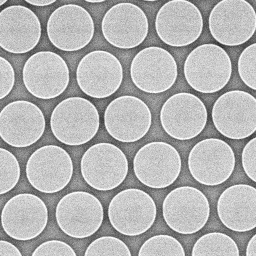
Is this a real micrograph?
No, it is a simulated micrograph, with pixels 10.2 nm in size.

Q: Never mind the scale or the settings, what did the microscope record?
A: an array of small figures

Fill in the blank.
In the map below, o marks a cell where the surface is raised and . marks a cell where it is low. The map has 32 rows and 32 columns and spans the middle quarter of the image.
o...oooooooooo...ooooooooooo..oo
o..ooooooooooo...ooooooooooo..oo
o..ooooooooooo...ooooooooooo..oo
o..ooooooooooo...ooooooooooo...o
o...oooooooooo....oooooooooo...o
o...oooooooooo....ooooooooo.....
.....oooooooo.......ooooo.......
......oooooo.................oo.
..o...........oooo.........ooooo
oooooo......oooooooo......oooooo
ooooooo....oooooooooo....ooooooo
oooooooo...oooooooooo...oooooooo
oooooooo..oooooooooooo..oooooooo
ooooooooo.oooooooooooo..oooooooo
ooooooooo.oooooooooooo..oooooooo
ooooooooo.ooooooooooo....ooooooo
oooooooo...oooooooooo....ooooooo
oooooooo....oooooooo......oooooo
ooooooo......oooooo.........oooo
ooooo...........................
.......ooooo........ooooooo.....
......oooooooo.....ooooooooo....
o....oooooooooo...ooooooooooo...
o....oooooooooo...ooooooooooo..o
oo..oooooooooooo..ooooooooooo..o
oo..oooooooooooo..ooooooooooo..o
oo..oooooooooooo..ooooooooooo...
oo...ooooooooooo..ooooooooooo...
oo...oooooooooo....ooooooooo....
o.....oooooooo......ooooooo.....
.......oooooo........ooooo......
................ooo.........oooo